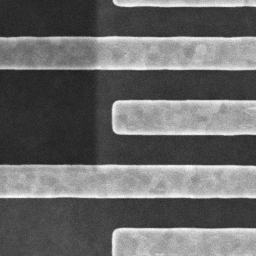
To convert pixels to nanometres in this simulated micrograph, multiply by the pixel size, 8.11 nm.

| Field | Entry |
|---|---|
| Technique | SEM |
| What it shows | wiring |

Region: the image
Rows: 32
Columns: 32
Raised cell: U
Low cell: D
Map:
DDDDDDDDDDDDDDDUUUUUUUUUUUUUUUUU
DDDDDDDDDDDDDDDDDDDDDDDDDDDDDDDD
DDDDDDDDDDDDDDDDDDDDDDDDDDDDDDDD
DDDDDDDDDDDDDDDDDDDDDDDDDDDDDDDD
DDDDDDDDDDDDDDDDDDDDDDDDDDDDDDDD
UUUUUUUUUUUUUUUUUUUUUUUUUUUUUUUU
UUUUUUUUUUUUUUUUUUUUUUUUUUUUUUUU
UUUUUUUUUUUUUUUUUUUUUUUUUUUUUUUU
UUUUUUUUUUUUUUUUUUUUUUUUUUUUUUUU
DDDDDDDDDDDDDDDDDDDDDDDDDDDDDDDD
DDDDDDDDDDDDDDDDDDDDDDDDDDDDDDDD
DDDDDDDDDDDDDDDDDDDDDDDDDDDDDDDD
DDDDDDDDDDDDDDDDDDDDDDDDDDDDDDDD
DDDDDDDDDDDDDDUUUUUUUUUUUUUUUUUU
DDDDDDDDDDDDDDUUUUUUUUUUUUUUUUUU
DDDDDDDDDDDDDDUUUUUUUUUUUUUUUUUU
DDDDDDDDDDDDDDUUUUUUUUUUUUUUUUUU
DDDDDDDDDDDDDDDDDDDDDDDDDDDDDDDD
DDDDDDDDDDDDDDDDDDDDDDDDDDDDDDDD
DDDDDDDDDDDDDDDDDDDDDDDDDDDDDDDD
DDDDDDDDDDDDDDDDDDDDDDDDDDDDDDDD
UUUUUUUUUUUUUUUUUUUUUUUUUUUUUUUU
UUUUUUUUUUUUUUUUUUUUUUUUUUUUUUUU
UUUUUUUUUUUUUUUUUUUUUUUUUUUUUUUU
UUUUUUUUUUUUUUUUUUUUUUUUUUUUUUUU
DDDDDDDDDDDDDDDDDDDDDDDDDDDDDDDD
DDDDDDDDDDDDDDDDDDDDDDDDDDDDDDDD
DDDDDDDDDDDDDDDDDDDDDDDDDDDDDDDD
DDDDDDDDDDDDDDDDDDDDDDDDDDDDDDDD
DDDDDDDDDDDDDDUUUUUUUUUUUUUUUUUU
DDDDDDDDDDDDDDUUUUUUUUUUUUUUUUUU
DDDDDDDDDDDDDDUUUUUUUUUUUUUUUUUU